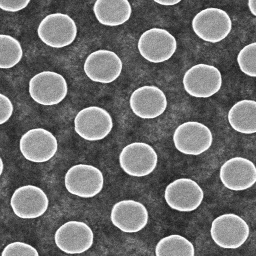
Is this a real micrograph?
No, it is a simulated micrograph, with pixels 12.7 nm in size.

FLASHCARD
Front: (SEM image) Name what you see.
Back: a regular array of raised bodies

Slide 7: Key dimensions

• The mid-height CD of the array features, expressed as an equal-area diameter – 446 nanometres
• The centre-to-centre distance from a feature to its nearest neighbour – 0.729 um